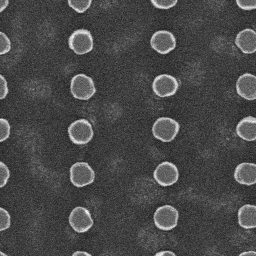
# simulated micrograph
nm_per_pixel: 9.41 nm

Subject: a regular array of raised bodies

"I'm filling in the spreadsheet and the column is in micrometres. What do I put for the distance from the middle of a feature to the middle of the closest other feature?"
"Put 0.41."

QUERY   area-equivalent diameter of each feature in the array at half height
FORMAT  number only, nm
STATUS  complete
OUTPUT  223